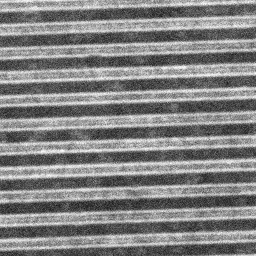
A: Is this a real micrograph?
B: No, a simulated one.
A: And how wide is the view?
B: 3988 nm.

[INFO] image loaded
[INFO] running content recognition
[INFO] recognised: parallel lines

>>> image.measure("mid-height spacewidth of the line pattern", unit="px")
14.2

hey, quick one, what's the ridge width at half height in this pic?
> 148 nm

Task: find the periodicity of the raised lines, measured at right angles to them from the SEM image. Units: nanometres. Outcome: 372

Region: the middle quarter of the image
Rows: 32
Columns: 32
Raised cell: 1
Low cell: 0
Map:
00000000000000000000000000000000
00000000001111111111111111111111
11111111111111111111111111111111
11111111111111000000000000000000
00000000000000000000000000000000
00000000000000000000000000000000
00000000000000000000000000000000
00000001111111111111111111111111
11111111111111111111111111111111
11111111111000000000000000000000
00000000000000000000000000000000
00000000000000000000000000000000
00000000000000000000000000000000
00000100000011111111111111111111
11111111111111111111111111111111
11111111111111110000000000000000
00000000000000000000000000000000
00000000000000000000000000000000
00000000000000000000000000000000
00000000011111111111111111111111
11111111111111111111111111111111
11111111111110000000000000000000
00000000000000000000000000000000
00000000000000000000000000000000
00000000000000000000000000000000
00000011111111111111111111111111
11111111111111111111111111111111
11111111110000000000000000000000
00000000000000000000000000000000
00000000000000000000000000000000
00000000000000000000000000000000
00011111111111111111111111111111